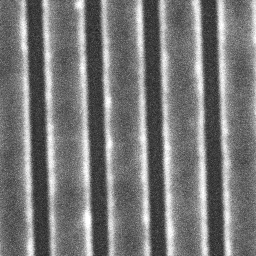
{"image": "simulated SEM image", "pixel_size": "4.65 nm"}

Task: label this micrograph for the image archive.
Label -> parallel lines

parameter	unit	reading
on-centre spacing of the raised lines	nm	270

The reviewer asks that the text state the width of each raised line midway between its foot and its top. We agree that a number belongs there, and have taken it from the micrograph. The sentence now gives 176 nm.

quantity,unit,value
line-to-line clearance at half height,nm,92.4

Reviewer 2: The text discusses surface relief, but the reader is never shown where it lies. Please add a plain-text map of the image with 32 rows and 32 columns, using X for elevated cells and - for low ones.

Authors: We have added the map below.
XXX---XXXX---XXXXX--XXXXX--XXXXX
XXX---XXXX---XXXXX--XXXXX--XXXXX
XXX---XXXX---XXXXX--XXXXX--XXXXX
XXX---XXXX---XXXXX--XXXXX---XXXX
XXX---XXXX---XXXXX--XXXXX---XXXX
XXX---XXXX---XXXXX--XXXXX---XXXX
XXX---XXXX---XXXXX--XXXXX---XXXX
XXX---XXXX---XXXXX--XXXXX---XXXX
XXX---XXXX---XXXXX--XXXXX---XXXX
XXX---XXXXX--XXXXX--XXXXX---XXXX
XXX---XXXXX--XXXXX--XXXXX---XXXX
XXX---XXXXX--XXXXX--XXXXX---XXXX
XXX---XXXXX--XXXXX--XXXXX---XXXX
XXX---XXXXX--XXXXX---XXXX---XXXX
XXX---XXXXX--XXXXX---XXXX---XXXX
XXX---XXXXX--XXXXX---XXXX---XXXX
XXX---XXXXX--XXXXX---XXXX---XXXX
XXXX--XXXXX--XXXXX---XXXX---XXXX
XXXX--XXXXX--XXXXX---XXXX---XXXX
XXXX--XXXXX--XXXXX---XXXX---XXXX
XXXX--XXXXX---XXXX---XXXX---XXXX
XXXX--XXXXX---XXXX---XXXXX--XXXX
XXXX--XXXXX---XXXX---XXXXX--XXXX
XXXX--XXXXX---XXXX---XXXXX--XXXX
XXXX--XXXXX---XXXX---XXXX---XXXX
XXXX--XXXXX---XXXX---XXXXX--XXXX
XXXX--XXXXX---XXXX---XXXXX--XXXX
XXXX--XXXXX---XXXX---XXXXX--XXXX
XXXX--XXXXX---XXXX---XXXXX--XXXX
XXXX--XXXXX---XXXX---XXXXX--XXXX
XXXX--XXXXX---XXXX---XXXXX--XXXX
XXXX---XXXX---XXXX---XXXXX--XXXX